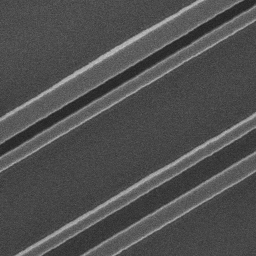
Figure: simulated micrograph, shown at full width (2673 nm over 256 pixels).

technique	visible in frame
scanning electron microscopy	lines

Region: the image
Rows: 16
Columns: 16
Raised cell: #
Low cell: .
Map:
............####
..........######
........######..
.......#####....
.....######.....
...######.......
..#####.........
######.........#
####..........##
##..........####
..........######
.........######.
.......######...
.....######.....
....######......
..######........